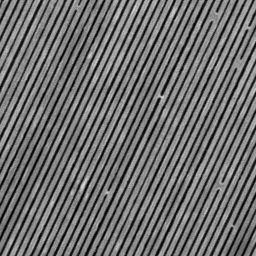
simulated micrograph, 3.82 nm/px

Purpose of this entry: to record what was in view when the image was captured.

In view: parallel lines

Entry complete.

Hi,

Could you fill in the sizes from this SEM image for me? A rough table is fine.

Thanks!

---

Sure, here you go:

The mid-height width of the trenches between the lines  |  10.8 nm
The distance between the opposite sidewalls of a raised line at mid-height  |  18.1 nm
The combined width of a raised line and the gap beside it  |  27 nm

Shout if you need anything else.